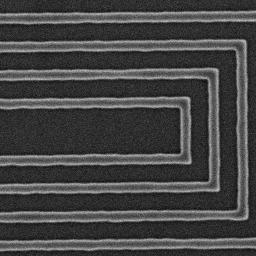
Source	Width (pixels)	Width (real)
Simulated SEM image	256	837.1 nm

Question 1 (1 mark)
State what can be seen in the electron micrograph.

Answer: groups of lines, slits or small figures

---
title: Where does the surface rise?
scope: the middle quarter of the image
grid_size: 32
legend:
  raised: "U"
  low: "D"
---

DDDDDDDDDDDDDDDDDDDDDDDDDDDDDDDD
DDDDDDDDDDDDDDDDDDDUUUUUUUUUUUUU
UUUUUUUUUUUUUUUUUUUUUUUUUUUUUUUU
UUUUUUUUUDDUUDDDDDUUUUUDDUUUUDDD
DDDDDDDDDDDDDDDDDDDDDDDDDDDDDDDD
DDDDDDDDDDDDDDDDDDDDDDDDDDDDDDDD
DDDDDDDDDDDDDDDDDDDDDDDDDDDDDDDD
DDDDDDDDDDDDDDDDDDDDDDDDDDDDDDDD
DDDDDDDDDDDDDDDDDDDDDDDUUUDUUUUD
UUUUUUUUUUUUUUUUUUUUUUUUUUUUUUUD
UUUUUUUUUUUUUUUUUUUUUUUUUUUUUUUD
DDDDDDDDDDDDDDDDDDDDDDDDDDDDDUUD
DDDDDDDDDDDDDDDDDDDDDDDDDDDDDUUD
DDDDDDDDDDDDDDDDDDDDDDDDDDDDDUUU
DDDDDDDDDDDDDDDDDDDDDDDDDDDDDUUU
DDDDDDDDDDDDDDDDDDDDDDDDDDDDDUUU
DDDDDDDDDDDDDDDDDDDDDDDDDDDDDUUD
DDDDDDDDDDDDDDDDDDDDDDDDDDDDDUUD
DDDDDDDDDDDDDDDDDDDDDDDDDDDDDUUD
DDDDDDDDDDDDDDDDDDDDDDDDDDDDDUUD
DDDDDDDDDDDDDDDDDDDDDDDDDDDDDUUD
DDDDDDDDDDDDDDDDDDDDDDDDDDDDDUUD
DDDDDDDDDDDDDDDDDDDDDDDDDDDDDUUD
UUUUUUUUUUUUUUUUUUUUUUUUUUUUUUUU
UUUUUUUUUUUUUUUUUUUUUUUUUUUUUUUU
DDDDDDDDDDDDDDDDDDDDDDDDDDDDDDDD
DDDDDDDDDDDDDDDDDDDDDDDDDDDDDDDD
DDDDDDDDDDDDDDDDDDDDDDDDDDDDDDDD
DDDDDDDDDDDDDDDDDDDDDDDDDDDDDDDD
DDDDDDDDDDDDDDDDDDDDDDDDDDDDDDDD
UUUUUUUUUUUUUUUUUUUUUUUUUUUUUUUU
UUUUUUUUUUUUUUUUUUUUUUUUUUUUUUUU